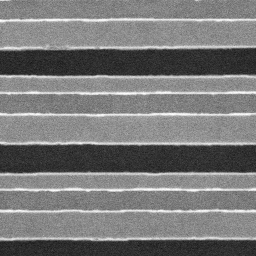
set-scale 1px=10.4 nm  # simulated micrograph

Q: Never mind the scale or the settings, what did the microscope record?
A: lines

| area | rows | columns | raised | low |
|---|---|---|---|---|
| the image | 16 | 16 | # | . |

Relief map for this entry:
################
################
################
................
................
################
################
################
################
................
................
################
################
################
################
................